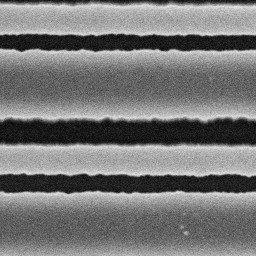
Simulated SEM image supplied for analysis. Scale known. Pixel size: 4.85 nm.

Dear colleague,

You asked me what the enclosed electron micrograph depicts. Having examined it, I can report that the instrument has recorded lines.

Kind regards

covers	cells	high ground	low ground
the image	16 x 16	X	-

XXXXXXXXXXXXXXXX
XXXXXXXXXXXXXXXX
XXXXXXXXXXXXXXXX
XXXXXXXXXXXXXXXX
XXXXXXXXXXXXXXXX
XXXXXXXXXXXXXXXX
XXXXXXXXXXXXXXXX
----------------
----------------
XXXXXXXXXXXXXXXX
XXXXXXXXXXXXXXXX
XXXXXXXXXXXXXXXX
XXXXXXXXXXXXXXXX
XXXXXXXXXXXXXXXX
XXXXXXXXXXXXXXXX
XXXXXXXXXXXXXXXX